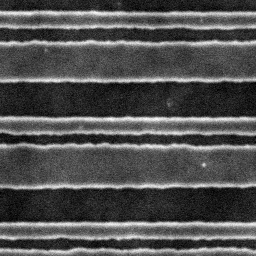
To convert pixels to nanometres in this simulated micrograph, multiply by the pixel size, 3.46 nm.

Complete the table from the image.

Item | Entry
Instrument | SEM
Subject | lines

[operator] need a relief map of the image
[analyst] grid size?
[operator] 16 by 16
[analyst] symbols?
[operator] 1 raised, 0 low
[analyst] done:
0000000000000000
1111111111111111
1111111111111111
1111111111111111
1111111111111111
0000000000000000
0000000000000000
1111111111111111
1111111111111111
1111111111111111
1111111111111111
1111111111111111
0000000000000000
0000000000000000
1111111111111111
1111111111111111